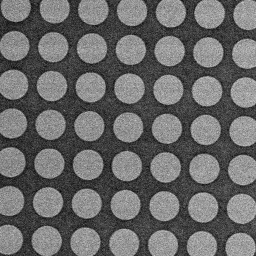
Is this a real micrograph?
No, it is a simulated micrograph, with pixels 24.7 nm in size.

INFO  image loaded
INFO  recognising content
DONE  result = an array of small figures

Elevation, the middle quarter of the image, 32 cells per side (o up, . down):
................................
................................
.....ooo........o...............
....oooooo....ooooo.....oooo....
o..ooooooo...ooooooo...oooooo...
o..ooooooo...ooooooo...ooooooo..
o..ooooooo...ooooooo..oooooooo..
...ooooooo...ooooooo..oooooooo..
....ooooo....oooooo....oooooo...
...............ooo......oooo....
................................
................................
....oooo.......ooo..............
...oooooo....oooooo....ooooo....
...ooooooo...oooooo...ooooooo...
...ooooooo..oooooooo..ooooooo...
...ooooooo..oooooooo..ooooooo...
...oooooo....oooooo...ooooooo...
....oooo.....oooooo....oooooo...
........................ooo.....
................................
................................
....ooooo.....oooo......ooo.....
...oooooo....oooooo....ooooo....
..oooooooo..ooooooo...ooooooo...
..oooooooo..ooooooo...ooooooo...
...oooooo...ooooooo...ooooooo..o
...oooooo....oooooo...ooooooo...
....oooo......oooo.....ooooo....
................................
................................
....ooo.........................